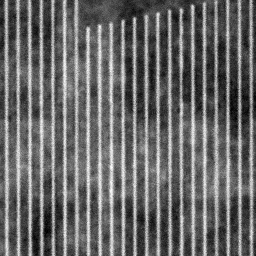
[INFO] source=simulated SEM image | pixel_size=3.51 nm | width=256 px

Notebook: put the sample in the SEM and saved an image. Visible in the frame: parallel lines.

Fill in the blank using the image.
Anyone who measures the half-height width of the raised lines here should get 0.0088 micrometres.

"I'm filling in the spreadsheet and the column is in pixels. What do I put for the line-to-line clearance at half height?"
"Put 9.23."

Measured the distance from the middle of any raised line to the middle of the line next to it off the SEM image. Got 40.8 nm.